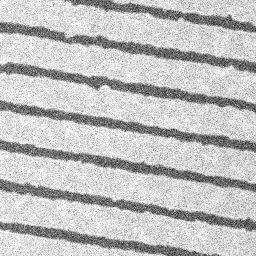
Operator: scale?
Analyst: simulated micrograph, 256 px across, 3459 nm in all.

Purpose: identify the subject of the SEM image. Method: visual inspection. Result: parallel lines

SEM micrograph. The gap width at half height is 155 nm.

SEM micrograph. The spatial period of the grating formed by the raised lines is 529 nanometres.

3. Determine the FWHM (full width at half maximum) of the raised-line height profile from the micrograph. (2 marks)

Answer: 27.8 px